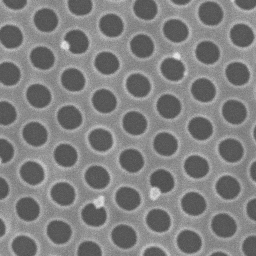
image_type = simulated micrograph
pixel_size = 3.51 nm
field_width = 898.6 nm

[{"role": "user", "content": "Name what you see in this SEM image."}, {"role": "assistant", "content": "a regular array of holes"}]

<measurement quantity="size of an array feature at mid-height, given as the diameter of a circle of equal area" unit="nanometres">87.8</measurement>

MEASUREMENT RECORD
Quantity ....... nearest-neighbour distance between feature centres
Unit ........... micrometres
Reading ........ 0.131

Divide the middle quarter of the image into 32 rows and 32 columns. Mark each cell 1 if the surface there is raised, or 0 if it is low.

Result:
11111111000000111111111100000011
00001111000000111111111100000011
00000111100011111000111100000011
00000111111111110000011110000011
00000111111111100000001111111111
00000111111111100000001111111111
10001111000111110000001111111111
11111110000011110000011110111111
11111110000001111110111100001111
11111110000001111111111000000111
00011110000001111111111000000111
00001111000001111111111000000111
00001111111111100001111100000111
00000111111111100000111110001111
00000111111111000000011111111110
00001111111111100000011111111110
10111110000111100000011111111110
11111100000011110000111000011111
11111100000011111111110000001111
11111100000011111111110000000111
00111110000011111111110000000111
00011110000111100011111000001111
00011111111111000001111100001111
00011111111111000000111111111110
00011111111111000000111111111100
00111110011111000000111111111100
11111100000111100001111001111100
11111000000111111111110000011110
11111000000011111111100000011111
11111000000111111111100000001111
00111100000111111111110000001111
00011111111110000011111100011111